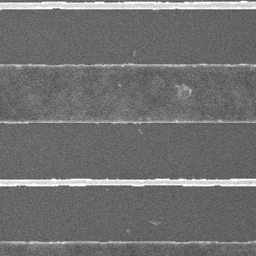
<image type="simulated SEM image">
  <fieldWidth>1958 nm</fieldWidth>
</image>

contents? lines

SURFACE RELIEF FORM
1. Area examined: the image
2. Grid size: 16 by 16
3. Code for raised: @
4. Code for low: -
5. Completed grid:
----------------
----------------
----------------
----------------
@@@@@@@@@@@@@@@@
@@@@@@@@@@@@@@@@
@@@@@@@@@@@@@@@@
@@@@@@@@@@@@@@@@
----------------
----------------
----------------
----------------
----------------
----------------
----------------
@@@@@@@@@@@@@@@@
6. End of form